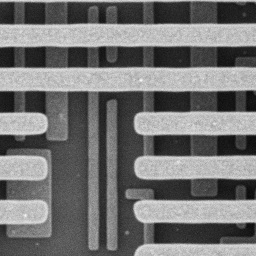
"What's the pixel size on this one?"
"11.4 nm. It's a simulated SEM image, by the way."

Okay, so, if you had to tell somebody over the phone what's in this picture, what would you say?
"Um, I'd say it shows wiring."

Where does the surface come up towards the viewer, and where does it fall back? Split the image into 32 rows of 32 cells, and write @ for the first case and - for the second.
--------------------------------
--------------------------------
--------------------------------
@@@@@@@@@@@@@@@@@@@@@@@@@@@@@@@@
@@@@@@@@@@@@@@@@@@@@@@@@@@@@@@@@
@@@@@@@@@@@@@@@@@@@@@@@@@@@@@@@@
--------------------------------
--------------------------------
----------------@@@-----@@@@@@@@
@@@@@@@@@@@@@@@@@@@@@@@@@@@@@@@@
@@@@@@@@@@@@@@@@@@@@@@@@@@@@@@@@
--------------------------------
--------------------------------
--------------------------------
@@@@@@-----------@@@@@@@@@@@@@@@
@@@@@@-----------@@@@@@@@@@@@@@@
@@@@@------------@@@@@@@@@@@@@@@
--------------------------------
--------------------------------
--------------------------------
@@@@@@-----------@@@@@@@@@@@@@@@
@@@@@@-----------@@@@@@@@@@@@@@@
--------------------------------
--------------------------------
--------------------------------
@@@@@@-----------@@@@@@@@@@@@@@@
@@@@@@-----------@@@@@@@@@@@@@@@
@@@@@@-----------@@@@@@@@@@@@@@@
--------------------------------
--------------------------------
--------------------------------
-----------------@@@@@@@@@@@@@@@